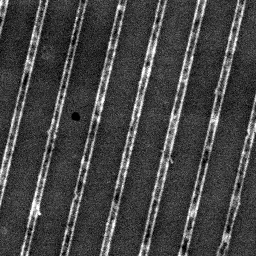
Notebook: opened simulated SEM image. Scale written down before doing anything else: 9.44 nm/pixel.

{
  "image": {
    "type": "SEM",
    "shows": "parallel lines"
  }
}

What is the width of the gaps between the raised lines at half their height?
303 nanometers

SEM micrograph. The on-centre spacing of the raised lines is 364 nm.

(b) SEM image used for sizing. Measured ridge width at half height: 63.2 nanometers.